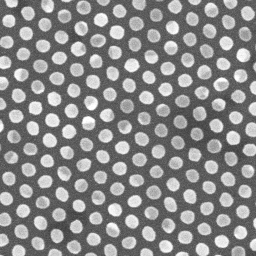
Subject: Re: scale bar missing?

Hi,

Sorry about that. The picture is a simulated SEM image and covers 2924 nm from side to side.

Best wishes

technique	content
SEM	a regular array of raised bodies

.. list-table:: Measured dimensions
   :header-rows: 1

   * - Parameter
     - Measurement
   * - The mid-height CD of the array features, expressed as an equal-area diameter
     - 145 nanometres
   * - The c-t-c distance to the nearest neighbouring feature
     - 234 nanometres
